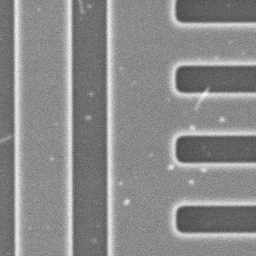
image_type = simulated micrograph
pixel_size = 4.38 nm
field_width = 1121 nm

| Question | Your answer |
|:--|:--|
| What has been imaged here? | groups of lines, slits or small figures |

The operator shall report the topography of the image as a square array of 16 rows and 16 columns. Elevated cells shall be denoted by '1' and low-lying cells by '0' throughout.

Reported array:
0111000111100000
0111000111111111
0111000111111111
0111000111111111
0111000111100000
0111000111100000
0111000111111111
0111000111111111
0111000111100000
0111000111100000
0111000111111111
0111000111111111
0111000111111111
0111000111100000
0111000111100000
0111000111111111